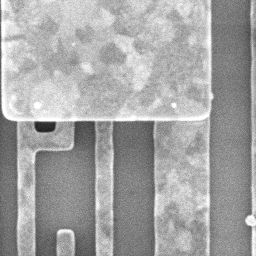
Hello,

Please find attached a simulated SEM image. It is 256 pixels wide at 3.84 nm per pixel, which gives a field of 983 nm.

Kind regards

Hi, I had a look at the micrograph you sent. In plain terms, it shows wiring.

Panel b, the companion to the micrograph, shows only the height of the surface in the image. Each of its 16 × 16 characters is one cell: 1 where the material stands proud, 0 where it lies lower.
1111111111111000
1111111111111000
1111111111111000
1111111111111000
1111111111111000
1111111111111000
1111111111111000
0111100000000000
0000000000000000
0000000000000000
0000000000000000
0000000000000000
0000000000000000
0000000000000000
0000000000000000
0000000000000000